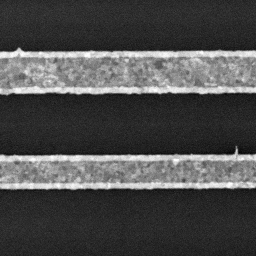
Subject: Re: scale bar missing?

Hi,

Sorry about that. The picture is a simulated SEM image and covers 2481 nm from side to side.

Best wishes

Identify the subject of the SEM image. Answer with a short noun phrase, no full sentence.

one or a few lines or trenches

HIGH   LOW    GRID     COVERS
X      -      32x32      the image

--------------------------------
--------------------------------
--------------------------------
--------------------------------
--------------------------------
--------------------------------
--X-----------------------------
XXXXXXXXXXXXXXXXXXXXXXXXXXXXXXXX
XXXXXXXXXXXXXXXXXXXXXXXXXXXXXXXX
XXXXXXXXXXXXXXXXXXXXXXXXXXXXXXXX
XXXXXXXXXXXXXXXXXXXXXXXXXXXXXXXX
--------------------------------
--------------------------------
--------------------------------
--------------------------------
--------------------------------
--------------------------------
--------------------------------
--------------------------------
-----------------------------X--
XXXXXXXXXXXXXXXXXXXXXXXXXXXXXXXX
XXXXXXXXXXXXXXXXXXXXXXXXXXXXXXXX
XXXXXXXXXXXXXXXXXXXXXXXXXXXXXXXX
--------------------------------
--------------------------------
--------------------------------
--------------------------------
--------------------------------
--------------------------------
--------------------------------
--------------------------------
--------------------------------